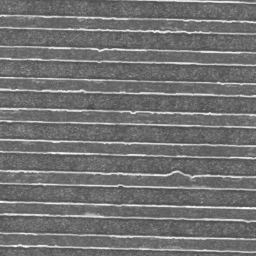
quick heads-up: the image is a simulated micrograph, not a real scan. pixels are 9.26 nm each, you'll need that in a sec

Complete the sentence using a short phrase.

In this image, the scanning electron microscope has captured parallel lines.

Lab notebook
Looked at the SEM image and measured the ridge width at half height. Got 0.124 micrometres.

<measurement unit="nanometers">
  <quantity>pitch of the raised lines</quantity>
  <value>288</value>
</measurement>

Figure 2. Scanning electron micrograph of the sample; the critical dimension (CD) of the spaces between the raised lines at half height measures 169 nm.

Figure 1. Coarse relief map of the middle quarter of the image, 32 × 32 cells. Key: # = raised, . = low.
................................
................................
................................
................................
############################....
################################
################################
.......................#########
................................
................................
................................
#...............................
################################
################################
################################
..............................#.
................................
................................
................................
#####...........................
################################
################################
.........#######################
................................
................................
................................
................................
##########.#######........####..
################################
################################
.............###################
................................